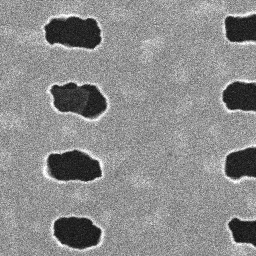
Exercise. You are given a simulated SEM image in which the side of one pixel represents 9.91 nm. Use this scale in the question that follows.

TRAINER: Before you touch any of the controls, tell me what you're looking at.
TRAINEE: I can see holes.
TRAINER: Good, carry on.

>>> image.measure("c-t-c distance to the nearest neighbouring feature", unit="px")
66.4